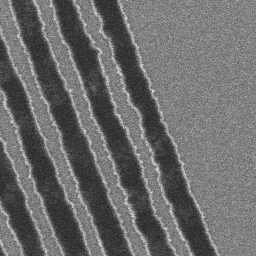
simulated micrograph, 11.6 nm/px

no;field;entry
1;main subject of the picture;parallel lines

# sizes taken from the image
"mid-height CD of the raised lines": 0.3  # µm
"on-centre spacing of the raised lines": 458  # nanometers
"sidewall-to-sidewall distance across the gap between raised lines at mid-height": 154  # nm